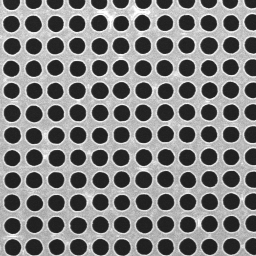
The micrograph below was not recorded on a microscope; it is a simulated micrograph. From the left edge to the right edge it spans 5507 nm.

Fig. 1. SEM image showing a regular array of holes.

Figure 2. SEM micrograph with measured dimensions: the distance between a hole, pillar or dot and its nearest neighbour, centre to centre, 465 nanometres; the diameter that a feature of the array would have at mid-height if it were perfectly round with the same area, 361 nanometers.